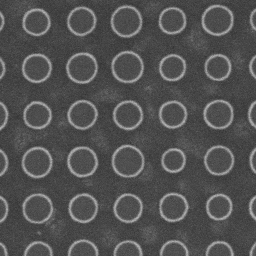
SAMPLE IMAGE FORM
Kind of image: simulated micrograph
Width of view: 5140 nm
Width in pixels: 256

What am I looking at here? a regular array of raised bodies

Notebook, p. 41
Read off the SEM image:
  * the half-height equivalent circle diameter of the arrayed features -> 554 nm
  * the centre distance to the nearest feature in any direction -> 908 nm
